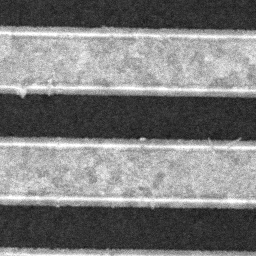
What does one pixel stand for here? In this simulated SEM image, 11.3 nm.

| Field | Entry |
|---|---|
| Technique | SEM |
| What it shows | one or a few lines or trenches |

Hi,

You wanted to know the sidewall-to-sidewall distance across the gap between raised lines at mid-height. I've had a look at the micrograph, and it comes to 0.65 µm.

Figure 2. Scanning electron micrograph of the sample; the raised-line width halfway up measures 602 nanometers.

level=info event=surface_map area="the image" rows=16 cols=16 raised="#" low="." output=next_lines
................
................
################
################
################
.#........######
................
................
................
################
################
################
.........#..####
................
................
................